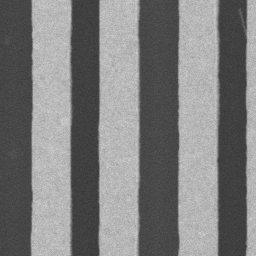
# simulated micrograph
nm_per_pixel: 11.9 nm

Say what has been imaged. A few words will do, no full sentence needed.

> lines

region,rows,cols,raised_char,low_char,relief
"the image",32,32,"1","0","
00001111100001111000001111100001
00001111100001111000001111100001
00001111100001111000001111100001
00001111100001111000001111100001
00001111100001111000001111100001
00001111100001111000001111100001
00001111100001111000001111100001
00001111100001111000001111100001
00001111100001111000001111100001
00001111100001111000001111100001
00001111100001111000001111100001
00001111100001111000001111100001
00001111100001111000001111100001
00001111100001111000001111100001
00001111100001111000001111100001
00001111100011111000001111100001
00001111100011111000001111100001
00001111100011111000001111100001
00001111100011111000001111100001
00001111100011111000001111100001
00001111100001111000001111100001
00001111100001111000001111100001
00001111100011111000001111100001
00001111100011111000001111100001
00001111100011111000001111100001
00001111100011111000001111100001
00001111100001111000001111100001
00001111100001111000001111100001
00001111100011111000001111100001
00001111100011111000001111100001
00001111100011111000001111100001
00001111100001111000001111100001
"